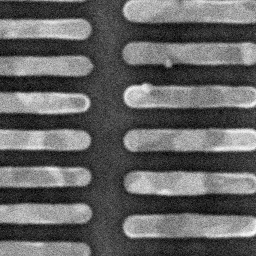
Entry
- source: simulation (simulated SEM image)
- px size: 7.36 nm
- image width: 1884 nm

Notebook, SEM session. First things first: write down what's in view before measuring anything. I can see groups of lines, slits or small figures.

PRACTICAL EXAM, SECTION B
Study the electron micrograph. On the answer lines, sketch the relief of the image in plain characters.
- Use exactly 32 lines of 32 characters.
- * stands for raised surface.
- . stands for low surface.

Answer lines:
................****************
................****************
................****************
***********.....................
***********.....................
................****............
...............*****************
***********.....****************
***********.....................
................................
................................
................****************
***********.....****************
***********.....................
................................
................................
****..****......****************
***********.....****************
***********.....****************
................................
................................
***********.....................
***********.....****************
................****************
................................
................................
***********.....................
***********.....****************
................****************
....................********....
***********.....................
***********.....................